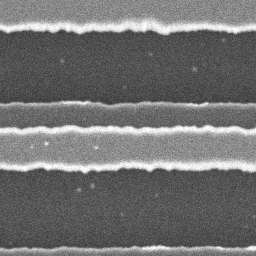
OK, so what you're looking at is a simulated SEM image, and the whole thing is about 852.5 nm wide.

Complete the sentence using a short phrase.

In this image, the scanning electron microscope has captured lines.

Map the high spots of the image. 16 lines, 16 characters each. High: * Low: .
****************
****************
................
................
................
................
******..*******.
****************
****************
****************
**.*****.*******
................
................
................
................
........******.*